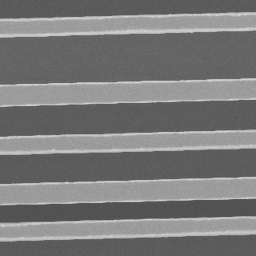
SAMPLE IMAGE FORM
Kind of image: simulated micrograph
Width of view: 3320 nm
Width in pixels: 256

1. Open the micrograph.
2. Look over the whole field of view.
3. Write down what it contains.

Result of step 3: lines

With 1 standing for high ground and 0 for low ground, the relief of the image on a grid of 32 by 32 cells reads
00000000000000000000000000000000
00000000000000000000000000000000
11111111111111111111111111111111
11111111111111111111111111111111
11111100000000000000000000000000
00000000000000000000000000000000
00000000000000000000000000000000
00000000000000000000000000000000
00000000000000000000000000000000
00000000000000000000000000000000
00000011111111111111111111111111
11111111111111111111111111111111
11111111111111111111111111111100
00000000000000000000000000000000
00000000000000000000000000000000
00000000000000000000000000000000
00000000000000000000000111111111
11111111111111111111111111111111
11111111111111111111111111111111
00000000000000000000000000000000
00000000000000000000000000000000
00000000000000000000000000000000
00000000000000000001111111111111
11111111111111111111111111111111
11111111111111111111111111111111
11000000000000000000000000000000
00000000000000000000000000000000
00000000000000111111111111111111
11111111111111111111111111111111
11111111111111111111111000000000
00000000000000000000000000000000
00000000000000000000000000000000